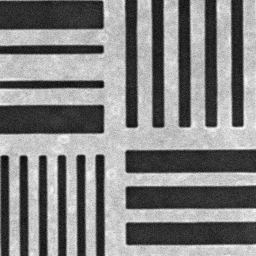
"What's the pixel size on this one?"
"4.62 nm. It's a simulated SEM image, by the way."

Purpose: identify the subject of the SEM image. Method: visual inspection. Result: groups of lines, slits or small figures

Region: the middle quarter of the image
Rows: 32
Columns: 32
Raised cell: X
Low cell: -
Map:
XXXXXXXXXXXXXXX----XXX---XXX----
XXXX-XXXXXXXXXX----XXX---XXX----
XXXXXXXXXXXXXXX----XXX---XXX----
XXXXXXXXXXXXXXX----XXX---XXX----
----------XXXXX----XXX---XXX----
----------XXXXX----XXX---XXX----
XXXXXXXXXXXXXXX----XXX---XXX----
XXXXXXXXXXXXXXX----XXX---XXX----
XXXXXXXXXXXXXXX----XXX---XXX----
XXXXXXXXXXXXXXX----XXX---XXX----
----------XXXXX----XXX---XXX----
----------XXXXX----XXX---XXXX---
----------XXXXX----XXX---XXXX---
----------XXXXX----XXX---XXXX---
----------XXXXX----XXX---XXXX---
----------XXXXX---XXXX---XXXX---
----------XXXXXXXXXXXXXXXXXXXXXX
---------XXXXXXXXXXXXXXXXXXXXXXX
XXXXXXXXXXXXXXXXXXXXXXXXXXXXXXXX
XXXXXXXXXXXXXXXXXXXXXXXXXXXXXXXX
XXXXXXXXXXXXXXXXXXXXXXXXXXXXXXXX
XXXXXXXXXXXXXXXX----------------
XXXX-XXX--XXXXX-----------------
-XX---XX--XXXXX-----------------
-XX---XX--XXXXX-----------------
-XX---XX--XXXXX-----------------
-XX---XX--XXXXX-----------------
-XX---XX--XXXXXX-----------XXXXX
-XX---XX--XXXXXXXXXXXXXXXXXXXXXX
-XX---XX--XXXXXXXXXXXXXXXXXXXXXX
-XX---XX--XXXXXX----------------
-XX---XX--XXXXX-----------------